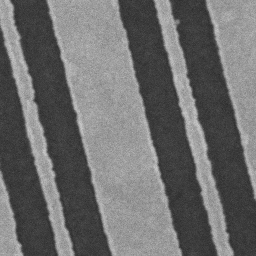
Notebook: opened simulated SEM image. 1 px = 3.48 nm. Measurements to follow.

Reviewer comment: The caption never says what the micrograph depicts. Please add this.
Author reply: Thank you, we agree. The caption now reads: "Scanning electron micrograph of lines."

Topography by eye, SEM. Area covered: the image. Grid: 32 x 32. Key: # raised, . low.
#.....#########....##.....######
##....#########.....#.....######
##.....########.....##....######
##.....#########....##.....#####
##.....#########....##.....#####
.#.....#########.....#.....#####
.##.....########.....##....#####
.##.....########.....##.....####
..#.....#########....##.....####
..##....#########.....#.....####
..##.....########.....##....####
..##.....########.....##.....###
...#.....#########....##.....###
...##....#########.....#.....###
...##.....########.....##....###
...##.....########.....##.....##
...##.....#########....##.....##
....##....#########.....##....##
....##.....########.....##....##
....##.....#########....##.....#
.....##....#########....##.....#
.....##....#########.....#.....#
.....##.....########.....##....#
#....##.....#########....##.....
#.....#.....#########....##.....
#.....##....#########....###....
##....##.....########.....##....
##....##.....########.....##....
##.....#.....#########....##....
##.....##....#########.....#....
##.....##.....########.....##...
###....##.....#########....##...